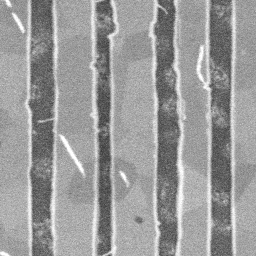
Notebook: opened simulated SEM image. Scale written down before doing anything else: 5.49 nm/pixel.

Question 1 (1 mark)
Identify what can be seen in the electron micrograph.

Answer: one or a few lines or trenches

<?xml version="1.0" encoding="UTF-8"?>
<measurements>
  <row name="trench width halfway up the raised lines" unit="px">23.4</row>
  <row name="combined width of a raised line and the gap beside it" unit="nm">326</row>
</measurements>